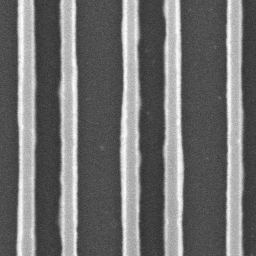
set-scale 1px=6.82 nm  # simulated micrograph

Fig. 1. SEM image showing lines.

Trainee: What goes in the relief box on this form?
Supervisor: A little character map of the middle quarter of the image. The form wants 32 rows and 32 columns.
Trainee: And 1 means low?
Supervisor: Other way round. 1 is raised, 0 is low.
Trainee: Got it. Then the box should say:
11100000000000011100000000110000
11100000000000011100000000110000
11100000000000011100000000110000
11100000000000011100000000111000
11100000000000011100000000111000
11100000000000011100000000111000
11100000000000011100000000111000
11100000000000011100000000110000
11100000000000011100000000111000
11100000000000011100000000111000
11100000000000011100000000111000
11100000000000011100000000111000
11100000000000011100000000111000
11100000000000011100000000111000
11100000000000011100000000111000
11100000000000011100000000111000
11100000000000011100000000111000
11100000000000011100000000111000
11100000000000011100000000111000
11100000000000011100000000111000
11100000000000011100000001111000
11100000000000011100000001111000
11100000000000011100000001111000
11100000000000011100000000111000
11100000000000011100000000111000
11100000000000011100000000111000
11100000000000011100000000111000
11100000000000011100000000111000
11100000000000011100000000111000
11100000000000011100000000111000
11100000000000011100000000111000
11100000000000011100000000111000